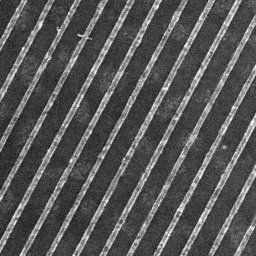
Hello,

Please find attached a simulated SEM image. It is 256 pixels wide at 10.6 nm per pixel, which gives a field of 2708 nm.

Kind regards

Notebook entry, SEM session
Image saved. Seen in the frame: parallel lines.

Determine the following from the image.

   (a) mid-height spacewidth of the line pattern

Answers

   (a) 0.208 micrometres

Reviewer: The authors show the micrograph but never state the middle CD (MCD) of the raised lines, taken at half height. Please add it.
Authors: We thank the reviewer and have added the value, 45.5 nanometers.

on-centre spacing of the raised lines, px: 23.7